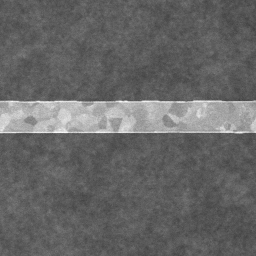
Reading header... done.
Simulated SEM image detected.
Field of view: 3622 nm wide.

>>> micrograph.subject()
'one or a few lines or trenches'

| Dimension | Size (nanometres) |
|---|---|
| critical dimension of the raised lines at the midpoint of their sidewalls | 444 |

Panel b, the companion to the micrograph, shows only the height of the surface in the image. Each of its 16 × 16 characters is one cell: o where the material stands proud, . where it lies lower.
................
................
................
................
................
................
oooooooooooooooo
oooooooooooooooo
................
................
................
................
................
................
................
................